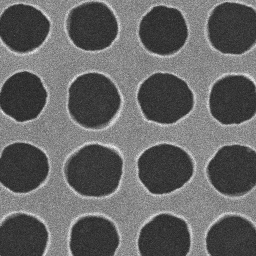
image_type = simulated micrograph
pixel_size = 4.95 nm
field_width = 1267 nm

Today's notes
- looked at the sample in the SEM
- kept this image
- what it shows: holes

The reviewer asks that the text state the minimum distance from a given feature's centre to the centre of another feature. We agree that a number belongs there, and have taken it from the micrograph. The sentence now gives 348 nm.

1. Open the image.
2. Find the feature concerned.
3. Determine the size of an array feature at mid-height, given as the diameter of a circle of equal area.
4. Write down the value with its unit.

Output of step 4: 262 nm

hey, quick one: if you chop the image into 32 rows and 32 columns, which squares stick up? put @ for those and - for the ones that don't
@@@@@@@@@@---@@@@@@@@@@@@@@@--@@
-----@@@@-----@@@@@----@@@@-----
------@@-------@@@-----@@@------
------@@-------@@------@@@------
------@@@------@@------@@@------
@----@@@@-----@@@@-----@@@------
@@--@@@@@@@@@@@@@@@---@@@@@@---@
@@@@@@@@@@@@@@@@@@@@@@@@@@@@@@@@
@@@@@@@@@@@@@@@@@@@@@@@@@@@@@@@@
@----@@@@@---@@@@@@---@@@@@@@-@@
-----@@@@-----@@@@-----@@@@-----
------@@@------@@-------@@------
------@@@------@@-------@@------
-----@@@@------@@@------@@------
@----@@@@-----@@@@-----@@@@-----
@@@@@@@@@@---@@@@@@@@@@@@@@@-@@@
@@@@@@@@@@@@@@@@@@@@@@@@@@@@@@@@
@@@@@@@@@@@@@@@@@@@@@@@@@@@@@@@@
@----@@@@@----@@@@@----@@@@@---@
------@@@------@@@------@@@-----
------@@-------@@-------@@------
------@@-------@@-------@@------
------@@-------@@@------@@------
@---@@@@@------@@@----@@@@@-----
@@@@@@@@@@---@@@@@@@@@@@@@@@@-@@
@@@@@@@@@@@@@@@@@@@@@@@@@@@@@@@@
@@@@@@@@@@@@@@@@@@@@@@@@@@@@@@@@
@----@@@@@----@@@@@----@@@@----@
------@@@------@@@-----@@@------
------@@@------@@-------@@------
------@@@------@@-------@@------
-----@@@@-----@@@-------@@------